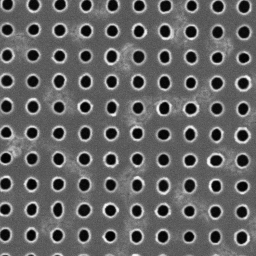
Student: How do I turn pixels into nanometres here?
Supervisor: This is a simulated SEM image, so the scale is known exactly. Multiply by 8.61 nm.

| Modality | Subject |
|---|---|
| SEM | a regular array of holes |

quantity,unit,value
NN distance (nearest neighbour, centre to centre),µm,0.22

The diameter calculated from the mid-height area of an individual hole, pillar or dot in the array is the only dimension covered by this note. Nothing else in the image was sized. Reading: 97.1 nanometers